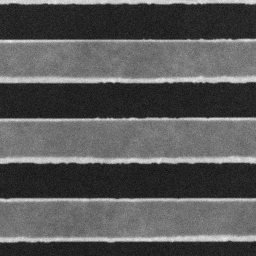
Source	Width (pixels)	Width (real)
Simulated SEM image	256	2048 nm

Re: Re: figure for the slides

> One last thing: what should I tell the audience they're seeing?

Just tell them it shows lines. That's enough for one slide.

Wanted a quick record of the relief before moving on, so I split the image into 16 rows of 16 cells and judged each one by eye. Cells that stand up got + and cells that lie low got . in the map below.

................
................
...............+
++++++++++++++++
++++++++++++++++
................
................
++++++++++++++++
++++++++++++++++
++++++++++++++++
................
................
++++++++++++++++
++++++++++++++++
++++++++++++++++
................